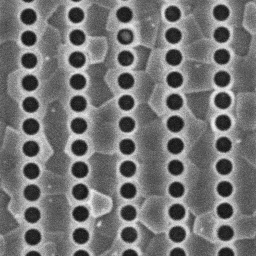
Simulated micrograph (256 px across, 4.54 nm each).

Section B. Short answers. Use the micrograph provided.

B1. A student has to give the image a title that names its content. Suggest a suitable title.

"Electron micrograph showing a regular array of holes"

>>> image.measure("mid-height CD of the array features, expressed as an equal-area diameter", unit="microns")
0.0791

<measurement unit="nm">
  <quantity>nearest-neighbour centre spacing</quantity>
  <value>99.5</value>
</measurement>